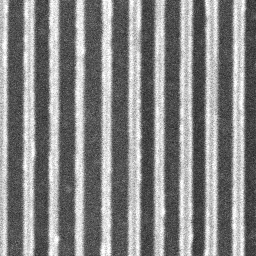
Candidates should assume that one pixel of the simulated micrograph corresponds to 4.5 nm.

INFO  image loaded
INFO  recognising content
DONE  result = parallel lines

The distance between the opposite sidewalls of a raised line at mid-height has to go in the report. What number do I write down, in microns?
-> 0.0461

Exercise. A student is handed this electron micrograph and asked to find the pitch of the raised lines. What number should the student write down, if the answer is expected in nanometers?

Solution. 118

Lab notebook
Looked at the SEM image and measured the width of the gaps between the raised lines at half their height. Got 72 nm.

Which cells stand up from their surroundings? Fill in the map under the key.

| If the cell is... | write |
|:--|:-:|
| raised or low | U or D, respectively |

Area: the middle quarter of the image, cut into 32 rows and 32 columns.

DDDUUDDDDDUUDDDDUUUDDDDUUDDDDUUU
DDDUUDDDDDUUDDDDUUUDDDDUUDDDDUUU
DDDUUDDDDDUUDDDDUUUDDDDUUDDDDUUU
DDDUUDDDDDUUDDDDUUUDDDDUUDDDDUUU
DDDUUDDDDDUUDDDDUUUDDDDUUDDDDUUU
DDDUUDDDDDUUDDDDUUUDDDDUUDDDDUUU
DDDUUDDDDDUUDDDDUUUDDDDUUDDDDUUU
DDDUUDDDDDUUDDDDUUUDDDDUUDDDDUUU
DDDUUDDDDDUUDDDDUUUDDDDUUDDDDUUU
DDDUUDDDDDUUDDDDUUUDDDDUUDDDDUUU
DDDUUDDDDDUUDDDDUUUDDDDUUDDDDUUU
DDDUUDDDDDUUDDDDUUUDDDDUUDDDDUUU
DDDUUDDDDDUUDDDDUUUDDDDUUDDDDUUU
DDDUUDDDDDUUDDDDUUUDDDDUUDDDDUUU
DDDUUDDDDDUUDDDDUUUDDDDUUDDDDUUU
DDDUUDDDDDUUDDDDUUUDDDDUUDDDDUUU
DDDUUDDDDDUUDDDDUUUDDDDUUDDDDUUU
DDDUUDDDDDUUDDDDUUUDDDDUUDDDDUUU
DDDUUDDDDDUUDDDDUUUDDDDUUDDDDUUU
DDDUUDDDDDUUDDDDUUUDDDDUUDDDDUUU
DDDUUDDDDDUUDDDDUUUDDDDUUDDDDUUU
DDDUUDDDDDUUDDDDUUUDDDDUUDDDDUUU
DDDUUDDDDDUUDDDDUUUDDDDUUDDDDUUU
DDDUUDDDDDUUDDDDUUUDDDDUUDDDDUUU
DDDUUDDDDDUUDDDDUUUDDDDUUDDDDUUU
DDDUUDDDDDUUDDDDUUUDDDDUUDDDDUUU
DDDUUDDDDDUUDDDDUUUDDDDUUDDDDUUU
DDDUUDDDDDUUDDDDUUUDDDDUUDDDDUUU
DDDUUDDDDDUDDDDDUUUDDDDUUDDDDUUU
DDDUUDDDDDUDDDDDUUUDDDDUUDDDDUUU
DDDUUDDDDDUDDDDDUUUDDDDUUDDDDUUU
DDDUUDDDDDUDDDDDUUUDDDDUUDDDDUUU